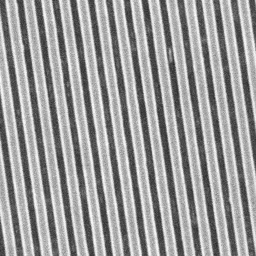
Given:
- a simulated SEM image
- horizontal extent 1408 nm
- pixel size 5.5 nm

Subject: parallel lines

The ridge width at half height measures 55.2 nm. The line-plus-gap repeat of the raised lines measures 97.3 nanometers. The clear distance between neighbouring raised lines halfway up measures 0.0416 micrometres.